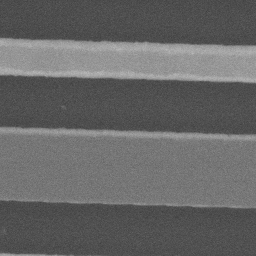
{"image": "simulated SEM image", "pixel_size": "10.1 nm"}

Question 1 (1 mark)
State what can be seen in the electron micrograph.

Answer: lines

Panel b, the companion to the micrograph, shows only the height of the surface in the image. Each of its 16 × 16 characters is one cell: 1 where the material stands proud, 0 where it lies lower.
0000000000000000
0000000000000000
1000000000000000
1111111111111111
1111111111111111
0000000000000000
0000000000000000
0000000000000000
1111111111111111
1111111111111111
1111111111111111
1111111111111111
1111111111111111
0000000000000000
0000000000000000
0000000000000000